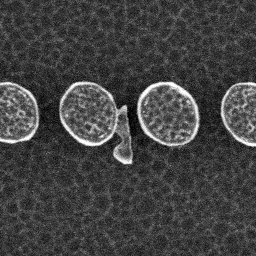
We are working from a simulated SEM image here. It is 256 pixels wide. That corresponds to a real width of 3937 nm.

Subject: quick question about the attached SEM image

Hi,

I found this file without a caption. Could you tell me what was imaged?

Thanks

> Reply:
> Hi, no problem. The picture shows raised bodies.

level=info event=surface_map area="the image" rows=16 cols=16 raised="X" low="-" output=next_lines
----------------
----------------
----------------
----------------
----------------
X---XX---XX---XX
XX--XXX--XXX--XX
XX--XXX--XXX--XX
XX---XX--XXX---X
----------------
----------------
----------------
----------------
----------------
----------------
----------------